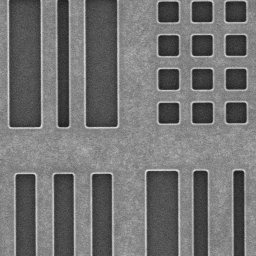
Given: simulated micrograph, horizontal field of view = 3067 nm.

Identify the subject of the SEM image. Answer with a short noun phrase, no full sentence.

groups of lines, slits or small figures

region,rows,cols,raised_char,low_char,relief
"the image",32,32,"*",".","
*....**..**....*****..**..**...*
*....**..**....*****...*...*...*
*....**..**....*****..**..**...*
*....**..**....*****************
*....**..**....*****..**..**...*
*....**..**....*****...*...*...*
*....**..**....*****..**...*...*
*....**..**....*****************
*....**..**....*****************
*....**..**....*****...*...*...*
*....**..**....*****...*...*...*
*....**..**....*****************
*....**..**....*****************
*....**..**....*****...*...*...*
*....**..**....*****...*...*...*
*....**..**....*****..***.***.**
********************************
********************************
********************************
********************************
********************************
*******************...**..***.**
**...**..**...****....**..***..*
**...**..**...****....**..***..*
**...**..**...****....**..***..*
**...**..**...****....**..***..*
**...**..**...****....**..***..*
**...**..**...****....**..***..*
**...**..**...****....**..***..*
**...**..**...****....**..***..*
**...**..**...****....**..***..*
**...**..**...****....**..***..*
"